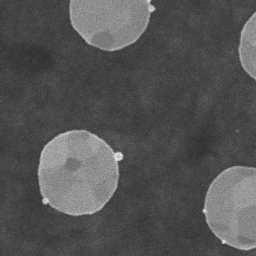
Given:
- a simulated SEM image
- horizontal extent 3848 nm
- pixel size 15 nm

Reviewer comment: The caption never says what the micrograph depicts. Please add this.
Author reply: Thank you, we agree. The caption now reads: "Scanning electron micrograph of raised bodies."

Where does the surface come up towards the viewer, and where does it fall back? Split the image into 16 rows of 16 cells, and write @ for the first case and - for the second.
----@@@@@-------
-----@@@@------@
-----@@@-------@
---------------@
---------------@
----------------
----------------
----------------
----@@----------
---@@@@---------
--@@@@@--------@
--@@@@@------@@@
---@@@@------@@@
-------------@@@
-------------@@@
---------------@